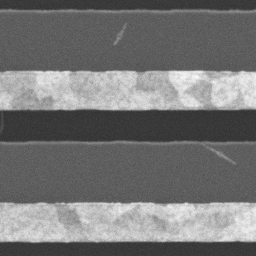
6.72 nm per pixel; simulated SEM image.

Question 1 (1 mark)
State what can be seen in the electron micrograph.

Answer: lines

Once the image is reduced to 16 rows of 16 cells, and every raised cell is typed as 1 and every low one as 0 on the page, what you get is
0000000000000000
1111111111111111
1111111111111111
1111111111111111
1111111111111111
1111111111111111
1111111111111111
0000000000000000
0000000000000000
1111111111111111
1111111111111111
1111111111111111
1111111111111111
1111111111111111
1111111111111111
0000000000000000